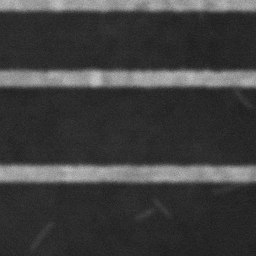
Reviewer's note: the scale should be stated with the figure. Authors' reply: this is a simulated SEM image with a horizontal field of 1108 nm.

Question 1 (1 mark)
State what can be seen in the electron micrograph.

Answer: lines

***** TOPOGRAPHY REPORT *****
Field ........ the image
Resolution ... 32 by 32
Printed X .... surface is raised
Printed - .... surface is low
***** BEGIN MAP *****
XXXXXXXXXXXXXXXXXXXXXXXXXXXXXXXX
--------------------------------
--------------------------------
--------------------------------
--------------------------------
--------------------------------
--------------------------------
--------------------------------
--------------------------------
XXXXXXXXXXXXXXXXXXXXXXXXXXXXXXXX
XXXXXXXXXXXXXXXXXXXXXXXXXXXXXXXX
--------------------------------
--------------------------------
--------------------------------
--------------------------------
--------------------------------
--------------------------------
--------------------------------
--------------------------------
--------------------------------
--------------------------------
XXXXXXXXXXXXXXXXXXXXXXXXXXXXXXXX
XXXXXXXXXXXXXXXXXXXXXXXXXXXXXXXX
--------------------------------
--------------------------------
--------------------------------
--------------------------------
--------------------------------
--------------------------------
--------------------------------
--------------------------------
--------------------------------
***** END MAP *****